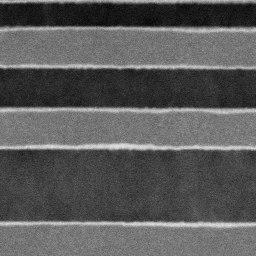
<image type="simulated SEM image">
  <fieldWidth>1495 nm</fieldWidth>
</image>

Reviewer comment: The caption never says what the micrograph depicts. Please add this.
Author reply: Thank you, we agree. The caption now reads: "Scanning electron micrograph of lines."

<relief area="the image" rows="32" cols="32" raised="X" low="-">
--------------------------------
--------------------------------
--------------------------------
-XXXXXXXXXXXXXXX----------------
XXXXXXXXXXXXXXXXXXXXXXXXXXXXXXXX
XXXXXXXXXXXXXXXXXXXXXXXXXXXXXXXX
XXXXXXXXXXXXXXXXXXXXXXXXXXXXXXXX
XXXXXXXXXXXXXXXXXXXXXXXXXXXXXXXX
----------------------------XXXX
--------------------------------
--------------------------------
--------------------------------
--------------------------------
--------------------------------
XXXXXXXXXXXXXXXXXXXXXXXXXXXXXXXX
XXXXXXXXXXXXXXXXXXXXXXXXXXXXXXXX
XXXXXXXXXXXXXXXXXXXXXXXXXXXXXXXX
XXXXXXXXXXXXXXXXXXXXXXXXXXXXXXXX
XX-------X--------XXXXXX-XXXXXXX
--------------------------------
--------------------------------
--------------------------------
--------------------------------
--------------------------------
--------------------------------
--------------------------------
--------------------------------
--------------------------------
XXXXXXXXXXXXXXXXXXXXXXXXXXXXXXXX
XXXXXXXXXXXXXXXXXXXXXXXXXXXXXXXX
XXXXXXXXXXXXXXXXXXXXXXXXXXXXXXXX
XXXXXXXXXXXXXXXXXXXXXXXXXXXXXXXX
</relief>